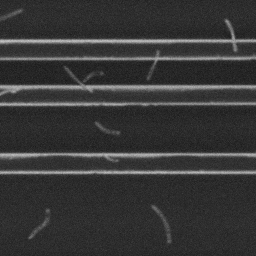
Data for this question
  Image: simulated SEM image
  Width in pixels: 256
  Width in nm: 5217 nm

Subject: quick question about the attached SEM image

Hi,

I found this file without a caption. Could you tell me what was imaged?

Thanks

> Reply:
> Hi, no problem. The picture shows lines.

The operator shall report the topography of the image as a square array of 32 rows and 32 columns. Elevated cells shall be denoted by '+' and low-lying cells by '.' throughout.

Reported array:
................................
................................
................................
................................
................................
++++++++++++++++++++++++++++++++
++++++++++++++++++++++++++++++++
...................+............
................................
................................
................................
++++++++++++++++++++++++++++++++
++++++++++++++++++++++++++++++++
................................
................................
................................
................................
................................
................................
++++++++++++++++++++++++++++++++
++++++++++++++++++++++++++++++++
++++++++++++++++++++++++++++++++
................................
................................
................................
................................
................................
................................
................................
................................
................................
................................